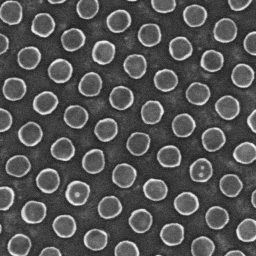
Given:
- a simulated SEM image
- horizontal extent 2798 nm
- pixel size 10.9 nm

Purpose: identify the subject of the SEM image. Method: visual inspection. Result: a regular array of raised bodies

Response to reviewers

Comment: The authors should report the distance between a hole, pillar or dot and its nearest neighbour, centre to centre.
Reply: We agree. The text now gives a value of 33.4 pixels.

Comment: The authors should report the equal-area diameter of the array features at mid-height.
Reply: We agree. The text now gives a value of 247 nm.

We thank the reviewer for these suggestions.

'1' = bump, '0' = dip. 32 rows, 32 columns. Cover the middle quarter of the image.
11000000000000011111100000000000
11000000000000011111000001000000
11000011000000001111000111110000
10000111100000000100000111110000
00001111100000000000000111110000
00001111100000000000000111110000
00001111100011110000000011000001
00000111000011111000000000000001
00000000000011111000000000000001
00000000000011111000011000000000
00110000000011110000111100000000
01111000000000000001111110000000
11111100000000000001111100000000
11111100000000000000111100001111
11111100011110000000111000011111
01111000111110000000000000011111
00000000111110000000000000011111
00000000111110000111000000001111
00000000011100001111100000000000
11000000000000001111100000000000
11000000000000001111100000000000
11000001100000001111100011111000
11000011110000000111000111111000
10000111110000000000000111111000
00000111110000000000000011111000
00000111110001111000000001110000
00000111100001111100000000000000
00000000000011111100000000000000
00000000000011111100000000000000
00010000000001111000011110000000
01111100000000111000111111000000
01111100000000000000111111000000